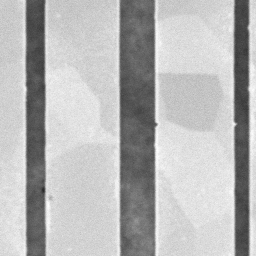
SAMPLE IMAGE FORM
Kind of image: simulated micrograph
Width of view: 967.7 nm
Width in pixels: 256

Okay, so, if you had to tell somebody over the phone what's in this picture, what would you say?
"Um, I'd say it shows one or a few lines or trenches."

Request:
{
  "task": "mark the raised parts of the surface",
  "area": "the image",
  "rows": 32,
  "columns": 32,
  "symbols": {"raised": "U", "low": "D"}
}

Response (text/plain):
UUUDDDUUUUUUUUUDDDDDUUUUUUUUUDDU
UUUDDDUUUUUUUUUDDDDDUUUUUUUUUDDU
UUUDDDUUUUUUUUUDDDDDUUUUUUUUUDDU
UUUDDDUUUUUUUUUDDDDDUUUUUUUUUDDU
UUUDDDUUUUUUUUUDDDDDUUUUUUUUUDDU
UUUDDDUUUUUUUUUDDDDDUUUUUUUUUDDU
UUUDDDUUUUUUUUUDDDDDUUUUUUUUUDDU
UUUDDDUUUUUUUUUDDDDDUUUUUUUUUDDU
UUUDDDUUUUUUUUUDDDDDUUUUUUUUUDDU
UUUDDDUUUUUUUUUDDDDDUUUUUUUUUDDU
UUUDDDUUUUUUUUUDDDDDUUUUUUUUUDDU
UUUDDDUUUUUUUUUDDDDDUUUUUUUUUDDU
UUUDDDUUUUUUUUUDDDDDUUUUUUUUUDDU
UUUDDDUUUUUUUUUDDDDDUUUUUUUUUDDU
UUUDDDUUUUUUUUUDDDDDUUUUUUUUUDDU
UUUDDDUUUUUUUUUDDDDDUUUUUUUUUDDU
UUUDDDUUUUUUUUUDDDDDUUUUUUUUUDDU
UUUDDDUUUUUUUUUDDDDDUUUUUUUUUDDU
UUUDDDUUUUUUUUUDDDDUUUUUUUUUUDDU
UUUDDDUUUUUUUUUDDDDDUUUUUUUUUDDU
UUUDDDUUUUUUUUUDDDDDUUUUUUUUUDDU
UUUDDDUUUUUUUUUDDDDDUUUUUUUUUDDU
UUUDDDUUUUUUUUUDDDDDUUUUUUUUUDDU
UUUDDDUUUUUUUUUDDDDDUUUUUUUUUDDU
UUUDDDUUUUUUUUUDDDDDUUUUUUUUUDDU
UUUDDDUUUUUUUUUDDDDDUUUUUUUUUDDU
UUUDDDUUUUUUUUUDDDDDUUUUUUUUUDDU
UUUDDDUUUUUUUUUDDDDDUUUUUUUUUDDU
UUUDDDUUUUUUUUUDDDDDUUUUUUUUUDDU
UUUDDDUUUUUUUUUDDDDDUUUUUUUUUDDU
UUUDDDUUUUUUUUUDDDDDUUUUUUUUUDDU
UUUDDDUUUUUUUUUDDDDDUUUUUUUUUDDU